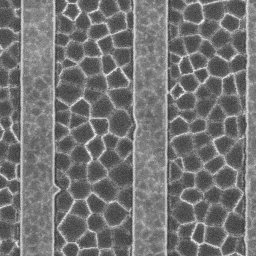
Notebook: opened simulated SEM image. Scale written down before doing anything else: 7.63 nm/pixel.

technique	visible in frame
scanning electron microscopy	one or a few lines or trenches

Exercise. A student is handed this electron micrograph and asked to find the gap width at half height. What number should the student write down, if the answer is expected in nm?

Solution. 614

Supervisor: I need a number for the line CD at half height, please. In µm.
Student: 0.246